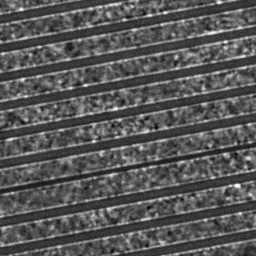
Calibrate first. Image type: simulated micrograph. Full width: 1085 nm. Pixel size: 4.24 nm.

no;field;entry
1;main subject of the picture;parallel lines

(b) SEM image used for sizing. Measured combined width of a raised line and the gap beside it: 121 nm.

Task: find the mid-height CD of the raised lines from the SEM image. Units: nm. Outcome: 76.1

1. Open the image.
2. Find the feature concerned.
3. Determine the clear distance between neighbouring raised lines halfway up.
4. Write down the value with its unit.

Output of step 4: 10.3 px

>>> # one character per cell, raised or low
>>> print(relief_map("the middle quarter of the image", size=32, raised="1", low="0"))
00000001111111111111111111111111
00111111111111111111111111100000
11111111111111111111000000000000
11111111111111100000000000000001
11111111111000000000000000111111
11111000000000000000111111111111
00000000000000011111111111111111
00000000011111111111111111111111
00001111111111111111111111110000
11111111111111111111111000000000
11111111111111111000000000000000
11111111111100000000000000011111
11111100000000000000011111111111
10000000000000001111111111111111
00000000001111111111111111111111
00000111111111111111111111111000
11111111111111111111111100000000
11111111111111111100000000000000
11111111111110000000000000001111
11111110000000000000001111111111
11000000000000000111111111111111
00000000000111111111111111111111
00000011111111111111111111111100
01111111111111111111111110000000
11111111111111111110000000000111
11111111111111000000000011111111
11111111000000000011111111111111
11100000000001111111111111111111
00000001111111111111111111111111
00111111111111111111111111111111
11111111111111111111111111100000
11111111111111111111100000000000